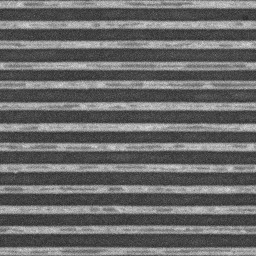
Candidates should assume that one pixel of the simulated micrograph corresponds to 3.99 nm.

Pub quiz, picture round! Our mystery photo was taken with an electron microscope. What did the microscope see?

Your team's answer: parallel lines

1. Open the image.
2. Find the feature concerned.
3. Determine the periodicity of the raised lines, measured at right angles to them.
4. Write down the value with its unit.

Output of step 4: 82.2 nanometers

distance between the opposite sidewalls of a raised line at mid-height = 27.4 nanometers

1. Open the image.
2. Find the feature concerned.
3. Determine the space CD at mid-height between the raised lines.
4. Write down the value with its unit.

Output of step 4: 55.4 nm